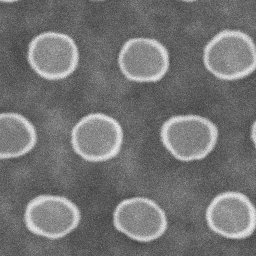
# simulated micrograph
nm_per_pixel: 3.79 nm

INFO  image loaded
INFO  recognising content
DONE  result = raised bodies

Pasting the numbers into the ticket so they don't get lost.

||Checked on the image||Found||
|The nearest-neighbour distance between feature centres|0.338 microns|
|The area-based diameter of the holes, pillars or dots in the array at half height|0.174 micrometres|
